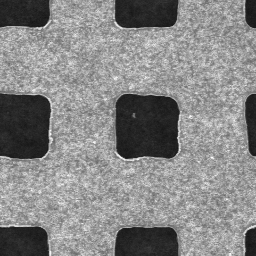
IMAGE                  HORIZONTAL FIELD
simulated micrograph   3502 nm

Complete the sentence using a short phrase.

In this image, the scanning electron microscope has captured holes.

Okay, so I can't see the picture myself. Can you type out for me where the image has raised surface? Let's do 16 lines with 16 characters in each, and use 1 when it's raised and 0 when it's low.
0001111000011110
0001111000011111
1111111111111111
1111111111111111
1111111111111111
1111111111111111
0001111000011110
0001111000011110
0001111000011110
0001111000011111
1111111111111111
1111111111111111
1111111111111111
1111111111111111
0001111100011111
0001111000011110